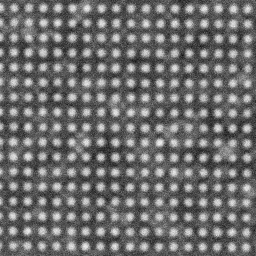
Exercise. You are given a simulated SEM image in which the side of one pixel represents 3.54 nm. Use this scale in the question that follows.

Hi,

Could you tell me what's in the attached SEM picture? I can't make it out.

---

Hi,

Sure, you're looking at a regular array of raised bodies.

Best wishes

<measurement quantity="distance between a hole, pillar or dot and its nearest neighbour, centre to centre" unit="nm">50.9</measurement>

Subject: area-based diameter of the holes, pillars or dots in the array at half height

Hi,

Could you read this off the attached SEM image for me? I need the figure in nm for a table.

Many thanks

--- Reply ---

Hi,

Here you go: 23.3